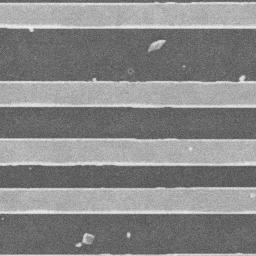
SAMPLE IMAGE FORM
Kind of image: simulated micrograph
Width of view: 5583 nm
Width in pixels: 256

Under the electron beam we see lines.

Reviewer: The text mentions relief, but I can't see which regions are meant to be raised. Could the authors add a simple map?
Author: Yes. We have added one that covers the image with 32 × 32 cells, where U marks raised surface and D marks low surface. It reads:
UUUUUUUUUUUUUUUUUUUUUUUUUUUUUUUU
UUUUUUUUUUUUUUUUUUUUUUUUUUUUUUUU
UUUUUUUUUUUUUUUUUUUUUUUUUUUUUUUU
DDDDDDDDDDDDDDDDDDDDDDDDDDDDDDDD
DDDDDDDDDDDDDDDDDDDDDDDDDDDDDDDD
DDDDDDDDDDDDDDDDDDDDDDDDDDDDDDDD
DDDDDDDDDDDDDDDDDDDDDDDDDDDDDDDD
DDDDDDDDDDDDDDDDDDDDDDDDDDDDDDDD
DDDDDDDDDDDDDDDDDDDDDDDDDDDDDDDD
DDDDDDDDDDDDDDDDDDDDDDDDDDDDDDDD
UUUUUUUUUUUUUUUUUUUUUUUUUUUUUUUU
UUUUUUUUUUUUUUUUUUUUUUUUUUUUUUUU
UUUUUUUUUUUUUUUUUUUUUUUUUUUUUUUU
DDDDDDDDDDDDDDDDDDDDDDDDDDDDDDDD
DDDDDDDDDDDDDDDDDDDDDDDDDDDDDDDD
DDDDDDDDDDDDDDDDDDDDDDDDDDDDDDDD
DDDDDDDDDDDDDDDDDDDDDDDDDDDDDDDD
UUUUUUUUUUUUUUUUUDDDDUDDDDDDDDDD
UUUUUUUUUUUUUUUUUUUUUUUUUUUUUUUU
UUUUUUUUUUUUUUUUUUUUUUUUUUUUUUUU
UUUUUUUUUUUUUUUUUUUUUUUUUUUUUUUU
DDDDDDDDDDDDDDDDDDDDDDDDDDDDDDDD
DDDDDDDDDDDDDDDDDDDDDDDDDDDDDDDD
DDDDDDDDDDDDDDDDDDDDDDDDDDDDDDDD
UUUUUUUUUUUUUUUUUUUUUUUUUUUUUUUU
UUUUUUUUUUUUUUUUUUUUUUUUUUUUUUUU
UUUUUUUUUUUUUUUUUUUUUUUUUUUUUUUU
DDDDDDDDDDDDDDDDDDDDDDDDDDDDDDDD
DDDDDDDDDDDDDDDDDDDDDDDDDDDDDDDD
DDDDDDDDDDDDDDDDDDDDDDDDDDDDDDDD
DDDDDDDDDDDDDDDDDDDDDDDDDDDDDDDD
DDDDDDDDDDDDDDDDDDDDDDDDDDDDDDDD